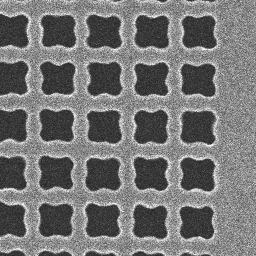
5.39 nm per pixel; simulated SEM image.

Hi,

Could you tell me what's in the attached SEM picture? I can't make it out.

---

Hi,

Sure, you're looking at a regular array of holes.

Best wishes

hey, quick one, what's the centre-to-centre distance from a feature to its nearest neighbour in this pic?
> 252 nm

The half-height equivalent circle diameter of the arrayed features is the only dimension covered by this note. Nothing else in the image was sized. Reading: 190 nm